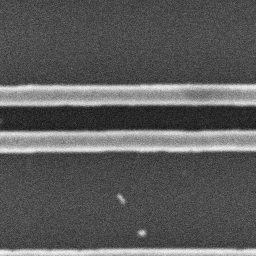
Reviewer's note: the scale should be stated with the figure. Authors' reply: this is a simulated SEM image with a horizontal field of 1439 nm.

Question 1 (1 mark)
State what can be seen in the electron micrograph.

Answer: lines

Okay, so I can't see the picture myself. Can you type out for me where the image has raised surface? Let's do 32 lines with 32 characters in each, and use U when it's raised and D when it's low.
DDDDDDDDDDDDDDDDDDDDDDDDDDDDDDDD
DDDDDDDDDDDDDDDDDDDDDDDDDDDDDDDD
DDDDDDDDDDDDDDDDDDDDDDDDDDDDDDDD
DDDDDDDDDDDDDDDDDDDDDDDDDDDDDDDD
DDDDDDDDDDDDDDDDDDDDDDDDDDDDDDDD
DDDDDDDDDDDDDDDDDDDDDDDDDDDDDDDD
DDDDDDDDDDDDDDDDDDDDDDDDDDDDDDDD
DDDDDDDDDDDDDDDDDDDDDDDDDDDDDDDD
DDDDDDDDDDDDDDDDDDDDDDDDDDDDDDDD
DDDDDDDDDDDDDDDDDDDDDDDDDDDDDDDD
DDDDDDDDDDDDDDDDDDDDDDDDDDDDDDDD
UUUUUUUUUUUUUUUUUUUUUUUUUUUUUUUU
UUUUUUUUUUUUUUUUUUUUUUUUUUUUUUUU
DDDDDDDDDDDDDDDDDDDDDDDDDDDDDDDD
DDDDDDDDDDDDDDDDDDDDDDDDDDDDDDDD
DDDDDDDDDDDDDDDDDDDDDDDDDDDDDDDD
DDDDDDDDDDUDDUUUUUUUUUUDDUUUUUUU
UUUUUUUUUUUUUUUUUUUUUUUUUUUUUUUU
UUUUUUUUUUUUUUUUUUUUUUUUUUUUUUUU
DDDDDDDDDDDDDDDDDDDDDDDDDDDDDDDD
DDDDDDDDDDDDDDDDDDDDDDDDDDDDDDDD
DDDDDDDDDDDDDDDDDDDDDDDDDDDDDDDD
DDDDDDDDDDDDDDDDDDDDDDDDDDDDDDDD
DDDDDDDDDDDDDDDDDDDDDDDDDDDDDDDD
DDDDDDDDDDDDDDDDDDDDDDDDDDDDDDDD
DDDDDDDDDDDDDDDDDDDDDDDDDDDDDDDD
DDDDDDDDDDDDDDDDDDDDDDDDDDDDDDDD
DDDDDDDDDDDDDDDDDDDDDDDDDDDDDDDD
DDDDDDDDDDDDDDDDDDDDDDDDDDDDDDDD
DDDDDDDDDDDDDDDDDDDDDDDDDDDDDDDD
DDDDDDDDDDDDDDDDDDDDDDDDDDDDDDDD
UUUUUUUUUUUUUUUUUUUUUUUUUUUUUUUU